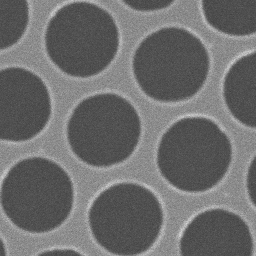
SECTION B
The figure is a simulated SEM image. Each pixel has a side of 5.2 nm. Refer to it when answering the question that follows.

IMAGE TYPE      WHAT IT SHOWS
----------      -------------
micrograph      holes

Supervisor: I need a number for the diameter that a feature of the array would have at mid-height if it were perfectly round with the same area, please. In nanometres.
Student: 390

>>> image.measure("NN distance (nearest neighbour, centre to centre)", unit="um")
0.482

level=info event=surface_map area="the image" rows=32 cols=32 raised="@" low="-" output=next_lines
----@@@@----@@@@-----@@@@-------
----@@@------@@@@@@@@@@@@-------
----@@--------@@@@@@@@@@@@------
---@@@---------@@@@@@--@@@@-----
---@@@---------@@@------@@@@@--@
--@@@@---------@@--------@@@@@@@
@@@@@@---------@@---------@@@@@@
@@@@@@--------@@@---------@@@@--
@--@@@@------@@@@---------@@@---
-----@@@@---@@@@@---------@@----
------@@@@@@@@@@@--------@@@----
------@@@@@@@@@@@@-------@@@----
------@@@@------@@@----@@@@@----
------@@@--------@@@@@@@@@@@----
------@@@--------@@@@@@@@@@@@---
------@@----------@@@@-----@@@--
-----@@@----------@@@-------@@@@
---@@@@@---------@@@---------@@@
@@@@@@@@@--------@@@---------@@@
@@@@@@@@@@------@@@@---------@@@
@@-----@@@@----@@@@@---------@@-
@-------@@@@@@@@@@@@--------@@@-
---------@@@@@@@@@@@@-------@@@-
---------@@@@@----@@@@----@@@@@-
---------@@@-------@@@@@@@@@@@@-
---------@@@--------@@@@@@@@@@@@
---------@@---------@@@@@----@@@
@-------@@@---------@@@@------@@
@@-----@@@@---------@@@--------@
@@@@@@@@@@@@--------@@@--------@
@@@@@@@@@@@@-------@@@----------
-@@@@@----@@@@----@@@@@---------